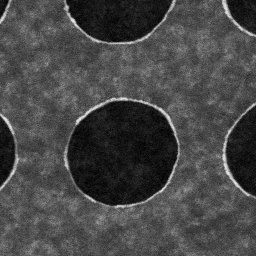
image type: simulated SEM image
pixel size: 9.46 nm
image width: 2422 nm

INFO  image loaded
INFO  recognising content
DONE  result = holes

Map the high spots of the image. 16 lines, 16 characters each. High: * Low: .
****.......***..
*****.....*****.
******..********
****************
****************
****************
*******..*******
*****.....*****.
.***.......***..
.***.......***..
.***.......***..
*****.....*****.
******...*******
****************
****************
****************